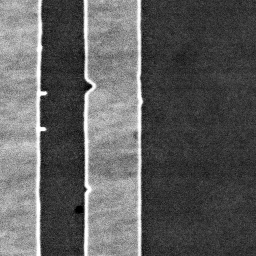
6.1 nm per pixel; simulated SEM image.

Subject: one or a few lines or trenches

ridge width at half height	0.332	um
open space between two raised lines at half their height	284	nanometres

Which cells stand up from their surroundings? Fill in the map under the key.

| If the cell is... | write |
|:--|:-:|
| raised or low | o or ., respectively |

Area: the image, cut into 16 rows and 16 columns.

ooo..oooo.......
ooo..oooo.......
ooo..oooo.......
ooo..oooo.......
oo...oooo.......
ooo...ooo.......
oo...oooo.......
oo...oooo.......
oo...oooo.......
oo...oooo.......
oo...oooo.......
oo...oooo.......
oo...oooo.......
oo...oooo.......
oo...oooo.......
oo...oooo.......